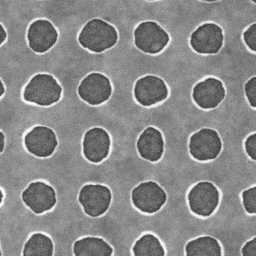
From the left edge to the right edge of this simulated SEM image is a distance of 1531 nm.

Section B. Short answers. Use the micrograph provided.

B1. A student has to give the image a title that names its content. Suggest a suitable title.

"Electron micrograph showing a regular array of holes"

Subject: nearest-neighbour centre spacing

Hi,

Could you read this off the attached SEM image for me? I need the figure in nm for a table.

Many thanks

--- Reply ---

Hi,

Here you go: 316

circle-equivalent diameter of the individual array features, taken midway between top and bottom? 198 nanometers